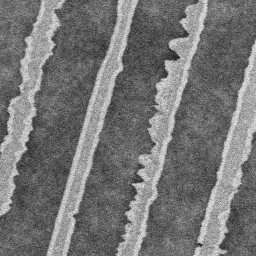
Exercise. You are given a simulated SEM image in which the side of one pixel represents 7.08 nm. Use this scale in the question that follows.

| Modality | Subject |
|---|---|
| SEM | one or a few lines or trenches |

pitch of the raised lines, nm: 503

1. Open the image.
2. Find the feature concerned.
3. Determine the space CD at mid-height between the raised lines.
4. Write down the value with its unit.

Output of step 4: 399 nm